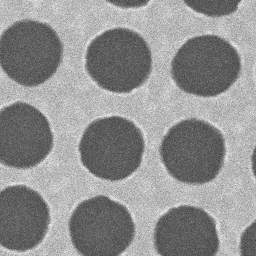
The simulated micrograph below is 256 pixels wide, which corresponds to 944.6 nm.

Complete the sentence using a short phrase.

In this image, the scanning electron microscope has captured holes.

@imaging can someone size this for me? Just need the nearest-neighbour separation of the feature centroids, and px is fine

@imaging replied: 84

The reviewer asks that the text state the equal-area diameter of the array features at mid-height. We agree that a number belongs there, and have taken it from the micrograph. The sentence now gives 238 nm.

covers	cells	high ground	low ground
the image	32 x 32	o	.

oooooooooooooo....ooooo.......oo
ooooooooooooooooooooooooo....ooo
oooooooooooooooooooooooooooooooo
o.....oooooooooooooooooooooooooo
.......ooooo.....oooooooo..ooooo
........ooo.......ooooo......ooo
........ooo........ooo........oo
........ooo........ooo........oo
.......oooo........oo.........oo
o......oooo.......oooo........oo
ooo..ooooooo......oooo.......ooo
oooooooooooooo..ooooooo.....oooo
oooooooooooooooooooooooooooooooo
o...oooooooooooooooooooooooooooo
......oooooooooooooooooooooooooo
......ooooo......ooooo....oooooo
......ooooo.......ooo......ooooo
.......ooo........oo........oooo
.......ooo........oo........oooo
......oooo........oo........oooo
o....ooooo.......ooo........oooo
ooooooooooo......oooo......ooooo
oooooooooooooo.ooooooo....oooooo
o...oooooooooooooooooooooooooooo
.....ooooooo.ooooooooooooooooooo
......oooo.....ooooooooooooooooo
......ooo.......ooooo.....oooooo
......ooo........ooo.......ooooo
......ooo........oo........oooo.
......ooo........oo........ooo..
.....oooo.......ooo........ooo..
oooooooooo.....ooooo.......ooo..